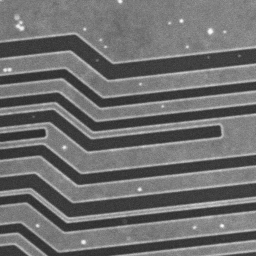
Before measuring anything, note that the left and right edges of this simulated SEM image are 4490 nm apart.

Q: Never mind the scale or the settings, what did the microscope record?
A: groups of lines, slits or small figures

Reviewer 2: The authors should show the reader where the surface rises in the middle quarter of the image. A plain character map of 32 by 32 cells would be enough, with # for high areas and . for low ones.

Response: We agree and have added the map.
######..........................
.#######........................
..#######..................#####
...#######.......###############
#....###########################
##....##########################
###....####################.....
####....###########.............
.#####..........................
..#####.................########
...#####......##################
....############################
##....###################.......
###....##########...............
.###..........................##
...##.................##########
....###.....###############.....
.....############...............
#.....###.......................
###.........................####
####................############
#####.....######################
################################
################################
###############################.
..###################...........
...##########...................
..............................##
#.....................##########
##..........####################
################################
###############################.